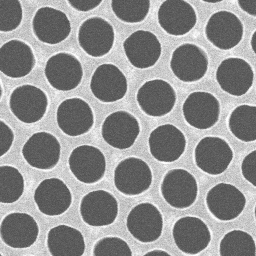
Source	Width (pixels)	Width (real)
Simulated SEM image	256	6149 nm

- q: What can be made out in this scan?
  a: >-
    a regular array of holes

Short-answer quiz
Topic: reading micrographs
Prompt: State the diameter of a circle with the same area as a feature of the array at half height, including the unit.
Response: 0.911 microns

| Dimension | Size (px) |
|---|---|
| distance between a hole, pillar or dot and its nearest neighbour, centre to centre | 46.7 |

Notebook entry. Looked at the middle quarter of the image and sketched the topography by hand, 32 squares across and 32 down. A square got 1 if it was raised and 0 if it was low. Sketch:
00001111100001111000001111000000
00000111000000111111111111100000
00000110000000011111111111100000
00000110000000001111111111110000
00001110000000001111000000111111
00011110000000001111000000011111
00111110000000001100000000001111
11111110000000011100000000001111
11001111000000011100000000001110
00000111110011111100000000001100
00000011111111111110000000011100
00000001111111111111000000011100
00000001111000000111100000111100
00000001110000000011111111111100
00000001110000000011111111111110
00000001100000000001111100001111
00000011100000000001110000000111
00000111100000000001110000000011
11111111110000000011100000000011
11111111110000000011100000000001
11110001111100000111100000000011
11000000011111111111100000000011
11000000001111111111110000000011
10000000001111110011111000000111
10000000001111000000111110011111
10000000001110000000011111111111
11000000001110000000001111000011
11000000001100000000001110000000
11100000011100000000001110000000
11111000111100000000001110000000
01111111111110000000001100000000
01111111001111000000011100000000